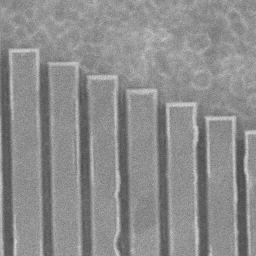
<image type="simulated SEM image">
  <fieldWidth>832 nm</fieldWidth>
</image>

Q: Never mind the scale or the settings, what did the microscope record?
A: parallel lines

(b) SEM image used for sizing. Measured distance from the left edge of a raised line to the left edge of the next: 128 nm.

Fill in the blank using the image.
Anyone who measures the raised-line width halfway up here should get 95.4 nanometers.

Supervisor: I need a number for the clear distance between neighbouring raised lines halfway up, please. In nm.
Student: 32.9